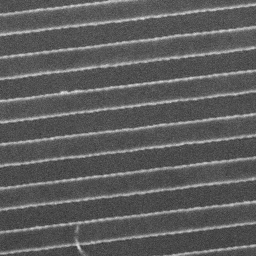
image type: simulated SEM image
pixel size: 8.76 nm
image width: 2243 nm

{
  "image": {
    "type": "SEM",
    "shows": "lines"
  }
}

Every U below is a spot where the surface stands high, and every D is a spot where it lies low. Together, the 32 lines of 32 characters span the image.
DDDDDDDDDDUUUUUUUUUUUUUUUUUUUUUU
DDUUUUUUUUUUUUUUUUUUUUUUUDDDDDDD
UUUUUUUUUUUUUUUUDDDDDDDDDDDDDDDD
UUUUUUUUDDDDDDDDDDDDDDDDDDDDDDUU
DDDDDDDDDDDDDDDDDDDDDDUUUUUUUUUU
DDDDDDDDDDDDDUUUUUUUUUUUUUUUUUUU
DDDDDUUUUUUUUUUUUUUUUUUUUUUUUDDD
UUUUUUUUUUUUUUUUUUUUDDDDDDDDDDDD
UUUUUUUUUUUDDDDDDDDDDDDDDDDDDDDD
UUUUDDDDDDDDDDDDDDDDDDDDDDUUUUUU
DDDDDDDDDDDDDDDDDDUUUUUUUUUUUUUU
DDDDDDDDDUUUUUUUUUUUUUUUUUUUUUUD
DUUUUUUUUUUUUUUUUUUUUUUUDDDDDDDD
UUUUUUUUUUUUUUUUDDDDDDDDDDDDDDDD
UUUUUUUDDDDDDDDDDDDDDDDDDDDDDUUU
DDDDDDDDDDDDDDDDDDDDDUUUUUUUUUUU
DDDDDDDDDDDDDUUUUUUUUUUUUUUUUUUU
DDDDUUUUUUUUUUUUUUUUUUUUUUUUDDDD
UUUUUUUUUUUUUUUUUUUDDDDDDDDDDDDD
UUUUUUUUUUUDDDDDDDDDDDDDDDDDDDDD
UUUDDDDDDDDDDDDDDDDDDDDDUUUUUUUU
DDDDDDDDDDDDDDDDUUUUUUUUUUUUUUUU
DDDDDDDDDUUUUUUUUUUUUUUUUUUUUUUD
UUUUUUUUUUUUUUUUUUUUUUUDDDDDDDDD
UUUUUUUUUUUUUUUDDDDDDDDDDDDDDDDD
UUUUUUDDDDDDDDDDDDDDDDDDDDDDDUUU
DDDDDDDDDDDDDDDDDDDDUUUUUUUUUUUU
DDDDDDDDDDDDUUUUUUUUUUUUUUUUUUUU
DDDUUUUUUUUUUUUUUUUUUUUUUUUDDDDD
UUUUUUUUUUUUUUUUUUUDDDDDDDDDDDDD
UUUUUUUUUUUDDDDDDDDDDDDDDDDDDDDD
UUDDDDDDDDDDDDDDDDDDDDDDUUUUUUUU